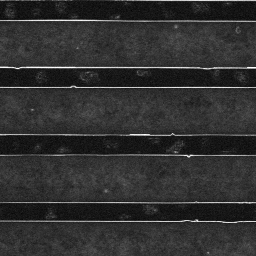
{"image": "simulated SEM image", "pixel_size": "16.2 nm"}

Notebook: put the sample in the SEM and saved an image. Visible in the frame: one or a few lines or trenches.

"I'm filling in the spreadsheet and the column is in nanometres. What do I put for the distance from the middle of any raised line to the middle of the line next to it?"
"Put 1090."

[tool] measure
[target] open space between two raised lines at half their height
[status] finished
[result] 758 nm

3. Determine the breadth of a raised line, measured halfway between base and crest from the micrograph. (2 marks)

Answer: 331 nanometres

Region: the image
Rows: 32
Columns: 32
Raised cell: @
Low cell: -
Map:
@@@@@@@@@@@@@@@@@@@@@@@@@@@@@@@@
@@@@@@@@@@@@@@@@@@@@@@@@@@@@@@@@
@@@--------@@@@@@@@@@@@@@@@@@@@@
--------------------------------
--------------------------------
--------------------------------
--------------------------------
--------------------------------
@@@@@@@@@@@@@@@@@@--------------
@@@@@@@@@@@@@@@@@@@@@@@@@@@@@@@@
@@@@@@@@@@@@@@@@@@@@@@@@@@@@@@@@
--------------------------------
--------------------------------
--------------------------------
--------------------------------
--------------------------------
--------------------------------
@@@@@@@@@@@@@@@@@@@@@@@@@@@@@@@@
@@@@@@@@@@@@@@@@@@@@@@@@@@@@@@@@
-----------------------@--------
--------------------------------
--------------------------------
--------------------------------
--------------------------------
--------------------------------
@@@@@@@@@@@@@@@@@@@@@@@@@@@@@@@@
@@@@@@@@@@@@@@@@@@@@@@@@@@@@@@@@
@@@@@@@@@@@@@@@@@@@@@@@@@@@@@@@@
--------------------------------
--------------------------------
--------------------------------
--------------------------------